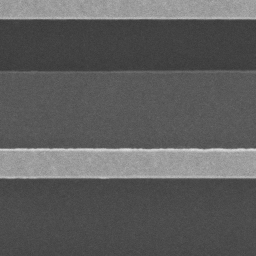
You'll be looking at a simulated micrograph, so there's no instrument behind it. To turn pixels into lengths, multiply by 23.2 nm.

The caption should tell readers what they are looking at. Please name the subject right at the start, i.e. lines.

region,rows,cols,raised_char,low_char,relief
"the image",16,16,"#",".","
################
................
................
................
................
################
################
################
################
################
################
................
................
................
................
................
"